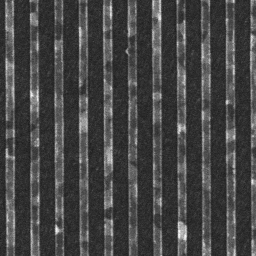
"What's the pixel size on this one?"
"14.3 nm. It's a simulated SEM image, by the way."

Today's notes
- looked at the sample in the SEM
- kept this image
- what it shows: parallel lines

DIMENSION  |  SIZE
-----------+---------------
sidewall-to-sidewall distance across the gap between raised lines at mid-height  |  236 nanometers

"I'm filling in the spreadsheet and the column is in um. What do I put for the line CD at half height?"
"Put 0.111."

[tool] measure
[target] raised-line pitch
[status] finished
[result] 0.351 microns